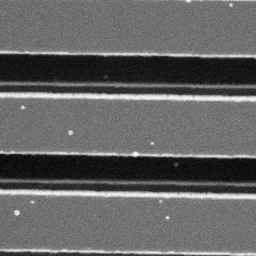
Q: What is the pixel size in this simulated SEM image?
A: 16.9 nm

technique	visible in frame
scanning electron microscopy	lines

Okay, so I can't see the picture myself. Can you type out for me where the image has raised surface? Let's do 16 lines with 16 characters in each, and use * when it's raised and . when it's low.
****************
****************
****************
............****
................
................
****************
****************
****************
****************
................
................
****************
****************
****************
****************